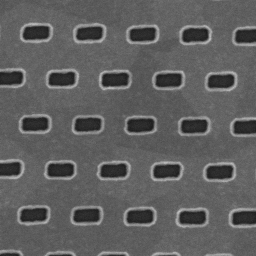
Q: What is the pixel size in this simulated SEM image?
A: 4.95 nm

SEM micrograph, a regular array of holes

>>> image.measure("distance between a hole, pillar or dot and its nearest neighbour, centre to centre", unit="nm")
259